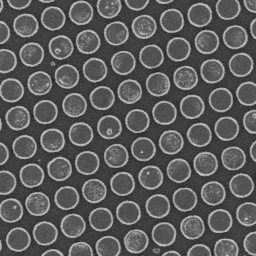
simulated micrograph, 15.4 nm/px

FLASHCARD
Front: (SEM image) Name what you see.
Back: a regular array of raised bodies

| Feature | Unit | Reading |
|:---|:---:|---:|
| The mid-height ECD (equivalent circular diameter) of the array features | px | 23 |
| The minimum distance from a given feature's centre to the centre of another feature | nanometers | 433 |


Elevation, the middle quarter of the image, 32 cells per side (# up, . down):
#....#####..######..###.........
###..######..####...........####
###..#####.....#.......##...####
####..####...........#####..####
###............###...#####..####
##............#####..#####..####
........####..#####..#####......
..#....#####..#####...###.......
#####..######.#####...........##
#####..#####...##........#...###
#####..#####...........####..###
#####.................######.###
.####...........#####.######..##
..........###...#####..#####....
.........#####..#####..####.....
..####...#####..#####...........
..#####..#####...###...........#
.######..#####...........####..#
..#####....#............#####..#
..####............####..######..
............##...######.######..
...........####..######..####...
....###...######.#####..........
...#####..######..####..........
#..######..####............###..
##.######...##............#####.
##..####............####..#####.
##...#.......###...#####..#####.
#...........#####..######..####.
......###...#####..#####........
.....#####..#####...####........
###..#####..#####...........####